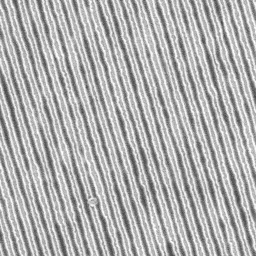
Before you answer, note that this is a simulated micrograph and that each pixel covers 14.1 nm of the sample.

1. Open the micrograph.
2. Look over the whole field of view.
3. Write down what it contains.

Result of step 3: parallel lines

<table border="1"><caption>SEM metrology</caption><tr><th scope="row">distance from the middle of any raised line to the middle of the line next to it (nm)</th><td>159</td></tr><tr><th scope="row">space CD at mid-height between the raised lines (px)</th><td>3.72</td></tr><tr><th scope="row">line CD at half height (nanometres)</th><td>103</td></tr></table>